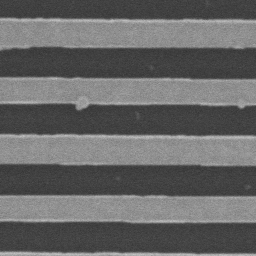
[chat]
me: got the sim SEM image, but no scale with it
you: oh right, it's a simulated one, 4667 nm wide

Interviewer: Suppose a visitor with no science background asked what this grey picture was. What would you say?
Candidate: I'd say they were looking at lines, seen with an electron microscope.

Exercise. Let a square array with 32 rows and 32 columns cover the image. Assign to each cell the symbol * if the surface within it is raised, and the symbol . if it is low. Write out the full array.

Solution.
................................
................................
***.**..........................
********************************
********************************
********************************
................................
................................
................................
................................
********************************
********************************
********************************
................................
................................
................................
................................
********************************
********************************
********************************
.......*************************
................................
................................
................................
................................
********************************
********************************
.....***************************
................................
................................
................................
................................